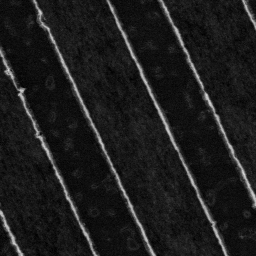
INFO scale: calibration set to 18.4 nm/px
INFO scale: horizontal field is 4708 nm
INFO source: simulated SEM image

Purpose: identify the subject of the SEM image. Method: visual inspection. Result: one or a few lines or trenches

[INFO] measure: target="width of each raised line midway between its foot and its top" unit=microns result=1.23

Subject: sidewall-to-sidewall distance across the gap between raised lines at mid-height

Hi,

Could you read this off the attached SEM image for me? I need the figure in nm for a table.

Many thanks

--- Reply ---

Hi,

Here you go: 924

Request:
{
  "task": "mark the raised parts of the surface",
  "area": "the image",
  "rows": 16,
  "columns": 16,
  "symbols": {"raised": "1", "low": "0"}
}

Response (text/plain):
0011111000111110
0001111000011111
0001111100011111
0000111100001111
1000111110001111
1000011110000111
1100011111000111
1100001111000011
1100001111100011
1110000111100001
1110000111110001
1111000011110001
1111000011111000
1111100011111000
0111100001111000
0111110001111100